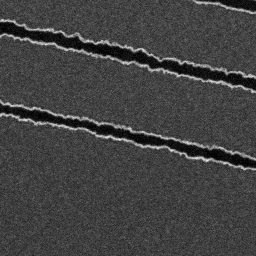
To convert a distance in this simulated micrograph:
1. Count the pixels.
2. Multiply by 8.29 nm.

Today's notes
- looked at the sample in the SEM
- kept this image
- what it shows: one or a few lines or trenches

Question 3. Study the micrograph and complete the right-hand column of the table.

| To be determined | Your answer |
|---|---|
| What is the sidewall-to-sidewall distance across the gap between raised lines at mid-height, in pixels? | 63.6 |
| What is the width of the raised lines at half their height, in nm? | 107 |